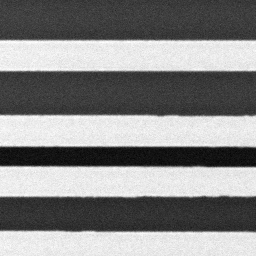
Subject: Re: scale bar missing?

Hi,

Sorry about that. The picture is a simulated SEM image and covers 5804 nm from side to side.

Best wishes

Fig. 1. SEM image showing lines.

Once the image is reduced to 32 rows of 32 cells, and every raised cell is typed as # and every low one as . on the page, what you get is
................................
................................
................................
................................
................................
################################
################################
################################
################################
................................
................................
................................
................................
................................
................................
################################
################################
################################
................................
................................
................................
################################
################################
################################
................................
................................
................................
................................
................................
################################
################################
################################